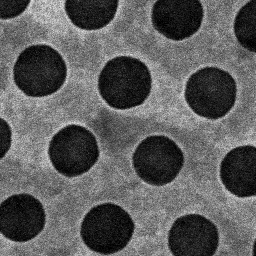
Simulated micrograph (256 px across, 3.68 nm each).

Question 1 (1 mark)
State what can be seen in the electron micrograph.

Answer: holes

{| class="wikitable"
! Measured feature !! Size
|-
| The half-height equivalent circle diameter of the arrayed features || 197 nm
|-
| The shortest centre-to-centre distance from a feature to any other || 312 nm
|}